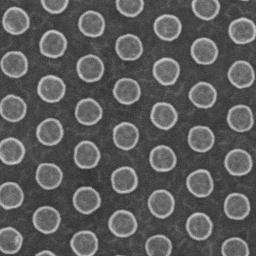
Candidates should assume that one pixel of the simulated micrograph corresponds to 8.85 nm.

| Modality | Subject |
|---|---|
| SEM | a regular array of raised bodies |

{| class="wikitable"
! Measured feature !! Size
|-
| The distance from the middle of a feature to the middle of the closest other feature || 43.1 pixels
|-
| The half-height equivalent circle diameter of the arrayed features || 227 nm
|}